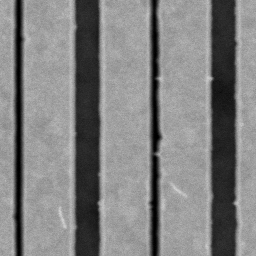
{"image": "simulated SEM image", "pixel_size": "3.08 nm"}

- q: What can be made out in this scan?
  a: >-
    one or a few lines or trenches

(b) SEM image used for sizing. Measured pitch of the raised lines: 0.21 um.